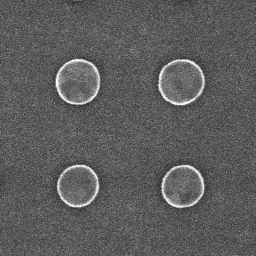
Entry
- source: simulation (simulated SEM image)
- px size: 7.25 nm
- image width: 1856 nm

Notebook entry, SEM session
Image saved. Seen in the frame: raised bodies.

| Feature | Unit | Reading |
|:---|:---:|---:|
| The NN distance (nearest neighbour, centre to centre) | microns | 0.75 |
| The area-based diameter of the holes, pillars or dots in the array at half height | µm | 0.308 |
